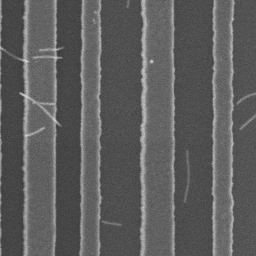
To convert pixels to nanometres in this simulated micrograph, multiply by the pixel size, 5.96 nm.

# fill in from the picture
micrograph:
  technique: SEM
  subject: lines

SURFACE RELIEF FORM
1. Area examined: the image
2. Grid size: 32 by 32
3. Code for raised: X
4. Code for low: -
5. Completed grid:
---XXXX---XXX-----XXXX-----XX---
---XXXX---XX------XXXX-----XX---
---XXXX---XX------XXXX-----XX---
---XXXX---XXX-----XXXX-----XX---
---XXXX---XXX-----XXXX-----XX---
---XXXX---XXX-----XXXX-----XX---
---XXXX---XXX-----XXXX-----XX---
---XXXX---XX------XXXX-----XX---
---XXXX---XXX-----XXXX-----XX---
---XXXX---XXX-----XXXX-----XX---
---XXXX---XX------XXXX-----XX---
---XXXX---XX------XXXX-----XX---
---XXXX---XX------XXXX-----XX---
---XXXX---XX------XXXX-----XX---
---XXXX---XX------XXXX-----XX---
---XXXX---XXX-----XXXX-----XX---
---XXXX---XXX-----XXXX-----XX---
---XXXX---XX------XXXX-----XX---
---XXXX---XX------XXXX-----XX---
---XXXX---XX------XXXX-----XX---
---XXXX---XX------XXXX-----XX---
---XXXX---XX------XXXX-----XX---
---XXXX---XX------XXXX-----XX---
---XXXX---XX------XXXX-----XX---
---XXXX---XXX-----XXXX-----XX---
---XXXX---XXX-----XXXX-----XX---
---XXXX---XX------XXXX-----XX---
---XXXX---XX------XXXX-----XX---
---XXXX---XX------XXXX-----XX---
---XXXX---XX------XXXX-----XX---
---XXXX---XX------XXXX-----XX---
---XXXX---XX------XXXX-----XX---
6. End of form